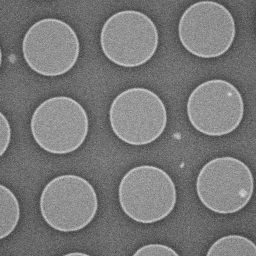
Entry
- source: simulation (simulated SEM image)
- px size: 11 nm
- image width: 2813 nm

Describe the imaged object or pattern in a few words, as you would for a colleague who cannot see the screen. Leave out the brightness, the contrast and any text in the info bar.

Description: an array of small figures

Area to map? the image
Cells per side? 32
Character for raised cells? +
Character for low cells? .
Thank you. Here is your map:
........................+++.....
...............++......+++++....
......+.......+++++....++++++...
....+++++....++++++...+++++++...
...++++++....+++++++...++++++...
...+++++++...+++++++...++++++...
...+++++++...++++++.....++++....
...++++++.....++++..............
....+++++.......................
................................
.........................++++...
................+++.....++++++..
......+++.....++++++....++++++..
.....+++++....+++++++..+++++++..
....+++++++...+++++++...++++++..
+...+++++++...+++++++...++++++..
+...+++++++...++++++.....++++...
+....+++++.....++++.............
+....++++.......................
................................
..........................++++..
................++++.....++++++.
.......+++.....++++++....+++++++
+.....+++++....+++++++...+++++++
++...+++++++...+++++++...++++++.
++...+++++++...+++++++....+++++.
++...+++++++....+++++......++...
++....+++++......+++............
++.....+++......................
+...............................
...........................+++++
.................+++++....++++++